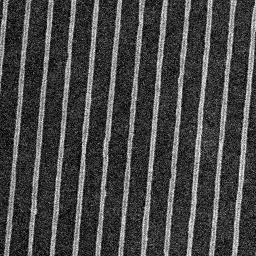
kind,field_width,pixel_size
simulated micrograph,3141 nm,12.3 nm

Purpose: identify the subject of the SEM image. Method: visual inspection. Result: parallel lines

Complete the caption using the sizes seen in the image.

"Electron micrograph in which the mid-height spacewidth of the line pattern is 228 nanometres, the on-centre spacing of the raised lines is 278 nm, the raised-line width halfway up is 45.8 nanometers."